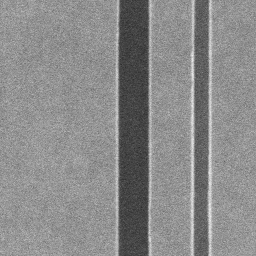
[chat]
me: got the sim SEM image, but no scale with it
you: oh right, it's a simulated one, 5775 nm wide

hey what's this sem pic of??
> lines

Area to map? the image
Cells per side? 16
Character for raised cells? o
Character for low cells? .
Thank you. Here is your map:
ooooooo..ooooooo
ooooooo..ooooooo
ooooooo..ooooooo
ooooooo..ooooooo
ooooooo..ooooooo
ooooooo..ooooooo
ooooooo..ooooooo
ooooooo..ooooooo
ooooooo..ooooooo
ooooooo..ooooooo
ooooooo..ooooooo
ooooooo..ooooooo
ooooooo..ooooooo
ooooooo..ooooooo
ooooooo..ooooooo
ooooooo..ooooooo